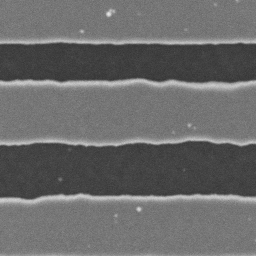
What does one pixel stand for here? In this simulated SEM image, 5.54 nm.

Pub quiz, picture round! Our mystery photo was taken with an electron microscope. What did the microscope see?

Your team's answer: lines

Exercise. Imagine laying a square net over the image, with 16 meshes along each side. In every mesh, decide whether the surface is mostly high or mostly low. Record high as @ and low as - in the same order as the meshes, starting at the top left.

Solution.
@@@@@@@@@@@@@@@@
@@@@@@@@@@@@@@@@
@@@@@@@@@@@@@@@@
----------------
----------------
@@@@@@@@@@@@@@@@
@@@@@@@@@@@@@@@@
@@@@@@@@@@@@@@@@
@@@@@@@@@@@@@@@@
----------------
----------------
----------------
@@@@@@@@@@@@@@@@
@@@@@@@@@@@@@@@@
@@@@@@@@@@@@@@@@
@@@@@@@@@@@@@@@@